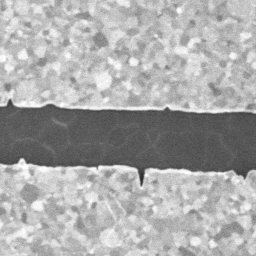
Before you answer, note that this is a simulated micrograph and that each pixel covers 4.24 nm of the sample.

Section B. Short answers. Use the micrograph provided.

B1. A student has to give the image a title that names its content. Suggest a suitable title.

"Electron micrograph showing one or a few lines or trenches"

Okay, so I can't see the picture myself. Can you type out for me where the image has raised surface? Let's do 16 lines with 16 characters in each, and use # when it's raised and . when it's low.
################
################
################
################
################
################
.###############
................
................
................
########........
################
################
################
################
################